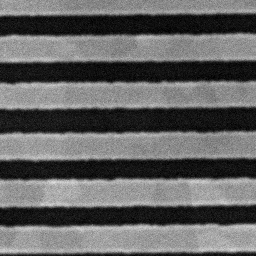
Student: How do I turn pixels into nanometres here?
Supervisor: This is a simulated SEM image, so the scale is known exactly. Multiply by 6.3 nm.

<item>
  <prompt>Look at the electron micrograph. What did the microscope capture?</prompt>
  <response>lines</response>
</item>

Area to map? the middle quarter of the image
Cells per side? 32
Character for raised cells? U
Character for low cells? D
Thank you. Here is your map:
DDDDDDDDDDDDDDDDDDDDDDDDDDDDDDDD
DDDDDDDDDDDDDDDDDDDDDDDDDDDDDDDD
DDDDDDDDDDDDDDDDDDDDDDDDDDDDDDDD
DDDDDDDDDDDDDDDDDDDDDDDDDDDDDDDD
DDDDDDDDDDDDDDDDDDDDDDDDDDDDDDDD
UUUUUUUUUUUUUUUUUUUUUUUUUUUUUUUU
UUUUUUUUUUUUUUUUUUUUUUUUUUUUUUUU
UUUUUUUUUUUUUUUUUUUUUUUUUUUUUUUU
UUUUUUUUUUUUUUUUUUUUUUUUUUUUUUUU
UUUUUUUUUUUUUUUUUUUUUUUUUUUUUUUU
UUUUUUUUUUUUUUUUUUUUUUUUUUUUUUUU
DDDDDDDDDDDDDDDDDDDDDDDDDDDDDDDD
DDDDDDDDDDDDDDDDDDDDDDDDDDDDDDDD
DDDDDDDDDDDDDDDDDDDDDDDDDDDDDDDD
DDDDDDDDDDDDDDDDDDDDDDDDDDDDDDDD
DDDDDDDDDDDDDDDDDDDDDDDDDDDDDDDD
DDDDDDDDDDDDDDDDDDDDDDDDDDDDDDDD
UUUUUUUUUUUUUUUUUUUUUUUUUUUUUUUU
UUUUUUUUUUUUUUUUUUUUUUUUUUUUUUUU
UUUUUUUUUUUUUUUUUUUUUUUUUUUUUUUU
UUUUUUUUUUUUUUUUUUUUUUUUUUUUUUUU
UUUUUUUUUUUUUUUUUUUUUUUUUUUUUUUU
UUUUUUUUUUUUUUUUUUUUUUUUUUUUUUUU
UUUUUUUUUUUUUDDUUUUUUUUUUUUUUUDD
DDDDDDDDDDDDDDDDDDDDDDDDDDDDDDDD
DDDDDDDDDDDDDDDDDDDDDDDDDDDDDDDD
DDDDDDDDDDDDDDDDDDDDDDDDDDDDDDDD
DDDDDDDDDDDDDDDDDDDDDDDDDDDDDDDD
DDDDDDDDDDDDDDDDDDDDDDDDDDDDDDDD
UUUUUUUUUUUUUUUUUUUUUUUUUUUUUUUU
UUUUUUUUUUUUUUUUUUUUUUUUUUUUUUUU
UUUUUUUUUUUUUUUUUUUUUUUUUUUUUUUU